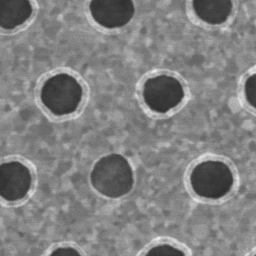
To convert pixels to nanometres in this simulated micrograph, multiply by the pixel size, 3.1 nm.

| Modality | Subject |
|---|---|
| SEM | holes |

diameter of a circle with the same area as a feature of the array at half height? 129 nm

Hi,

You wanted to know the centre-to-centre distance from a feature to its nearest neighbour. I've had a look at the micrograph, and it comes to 300 nanometres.